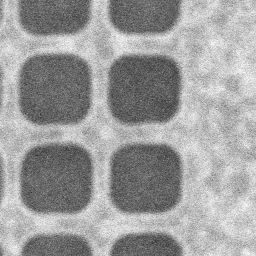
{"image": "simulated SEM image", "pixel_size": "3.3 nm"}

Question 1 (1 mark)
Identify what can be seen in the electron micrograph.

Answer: holes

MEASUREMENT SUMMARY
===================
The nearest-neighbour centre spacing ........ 293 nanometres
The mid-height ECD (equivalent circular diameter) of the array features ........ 259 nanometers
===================